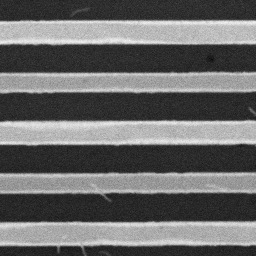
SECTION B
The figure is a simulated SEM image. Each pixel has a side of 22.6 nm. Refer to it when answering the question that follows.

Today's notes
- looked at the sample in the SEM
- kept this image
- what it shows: lines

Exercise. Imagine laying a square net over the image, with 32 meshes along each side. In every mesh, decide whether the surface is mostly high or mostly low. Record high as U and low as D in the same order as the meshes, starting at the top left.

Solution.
DDDDDDDDDDDDDDDDDDDDDDDDDDDDDDDD
DDDDDDDDDDDDDDDDDDDDDDDDDDDDDDDD
DDDDDDDDDDDDDDDDDDDDDDDDDDDDDDDD
UUUUUUUUUUUUUUUUUUUUUUUUUUUUUUUU
UUUUUUUUUUUUUUUUUUUUUUUUUUUUUUUU
DDDDDDDDDDDDDDDDDDDDDDDDDDDDDDDD
DDDDDDDDDDDDDDDDDDDDDDDDDDDDDDDD
DDDDDDDDDDDDDDDDDDDDDDDDDDDDDDDD
DDDDDDDDDDDDDDDDDDDDDDDDDDDDDDDD
UUUUUUUUUUUUUUUUUUUUUUUUUUUUUUUU
UUUUUUUUUUUUUUUUUUUUUUUUUUUUUUUU
DDDDDDDDDDDDDDDDDDDDDDDDDDDDDDDD
DDDDDDDDDDDDDDDDDDDDDDDDDDDDDDDD
DDDDDDDDDDDDDDDDDDDDDDDDDDDDDDDD
DDDDDDDDDDDDDDDDDDDDDDDDDDDDDDDD
UUUUUUUUUUUUUUUUUUUUUUUUUUUUUUUU
UUUUUUUUUUUUUUUUUUUUUUUUUUUUUUUU
UUUUUUUUUUUUUUUUUUUUUUUUUUUUUUUU
DDDDDDDDDDDDDDDDDDDDDDDDDDDDDDDD
DDDDDDDDDDDDDDDDDDDDDDDDDDDDDDDD
DDDDDDDDDDDDDDDDDDDDDDDDDDDDDDDD
DDDDDDDDDDDDDDDDDDDDDDDDDDDDDDDD
UUUUUUUUUUUUUUUUUUUUUUUUUUUUUUUU
UUUUUUUUUUUUUUUUUUUUUUUUUUUUUUUU
DDDDDDDDDDDDDDDDDDDDDDDDDDDDDDDD
DDDDDDDDDDDDDDDDDDDDDDDDDDDDDDDD
DDDDDDDDDDDDDDDDDDDDDDDDDDDDDDDD
DDDDDDDDDDDDDDDDDDDDDDDDDDDDDDDD
UUUUUUUUUUUUUUUUUUUUUUUUUUUUUUUU
UUUUUUUUUUUUUUUUUUUUUUUUUUUUUUUU
UUUUUUUUUUUUUUUUUUUUUUUUUUUUUUUU
DDDDDDDDDDDDDDDDDDDDDDDDDDDDDDDD